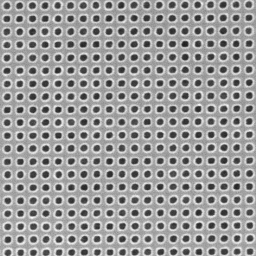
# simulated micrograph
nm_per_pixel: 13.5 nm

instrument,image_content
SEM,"a regular array of holes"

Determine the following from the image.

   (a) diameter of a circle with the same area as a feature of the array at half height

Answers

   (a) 0.102 micrometres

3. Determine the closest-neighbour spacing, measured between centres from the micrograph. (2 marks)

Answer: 12.4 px